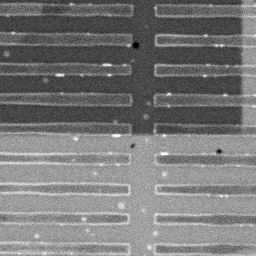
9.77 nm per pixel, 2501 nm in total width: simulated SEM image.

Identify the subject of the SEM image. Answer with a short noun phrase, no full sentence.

groups of lines, slits or small figures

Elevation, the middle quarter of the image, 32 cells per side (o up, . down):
ooooooooooooooooo......ooooooooo
ooooooooooooooooo......ooooooooo
ooooooooooooooooo......ooooooooo
................................
................................
................................
................................
................................
ooooooooooooooooo......ooooooooo
ooooooooooooooooo......ooooooooo
................................
................................
................................
................................
................................
ooooooooooooooooo......ooooooooo
ooooooooooooooooo......ooooooooo
..ooooooooooooooo......ooooooooo
................................
................................
................................
................................
........oooooo..................
ooooooooooooooooo......ooooooooo
oooooooooooooooo.......ooooooooo
................................
................................
................................
................................
................................
oooooooooooooooo.......ooooooooo
oooooooooooooooo.......ooooooooo